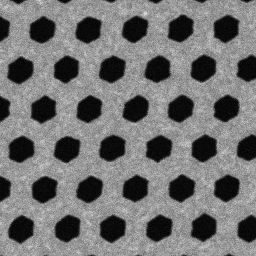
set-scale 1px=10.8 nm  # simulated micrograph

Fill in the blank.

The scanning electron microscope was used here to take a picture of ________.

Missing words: a regular array of holes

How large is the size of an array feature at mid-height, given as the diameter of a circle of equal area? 26.8 px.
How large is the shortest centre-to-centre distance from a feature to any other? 492 nm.